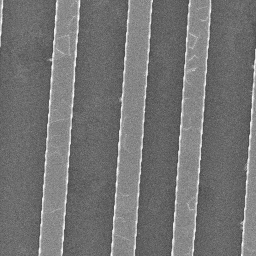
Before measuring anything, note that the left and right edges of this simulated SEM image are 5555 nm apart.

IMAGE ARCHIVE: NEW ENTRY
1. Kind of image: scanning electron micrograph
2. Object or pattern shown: lines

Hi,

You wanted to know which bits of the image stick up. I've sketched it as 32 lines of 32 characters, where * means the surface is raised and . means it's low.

.......***......***.....**......
.......***......***.....**......
.......***......***.....**......
.......***......***....***......
.......***......***....***......
.......***......***....***......
.......***......***....***......
.......***......**.....***......
.......**.......**.....***......
......***.......**.....***......
......***......***.....***......
......***......***.....***......
......***......***.....***......
......***......***.....**......*
......***......***.....**......*
......***......***.....**......*
......***......***.....**......*
......***......***....***......*
......***......***....***......*
......***......***....***......*
......***......***....***......*
......**.......***....***......*
......**.......**.....***......*
.....***.......**.....***......*
.....***......***.....***......*
.....***......***.....***......*
.....***......***.....**.......*
.....***......***.....**.......*
.....***......***.....**.......*
.....***......***.....**......**
.....***......***.....**......**
.....***......***.....**......**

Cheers